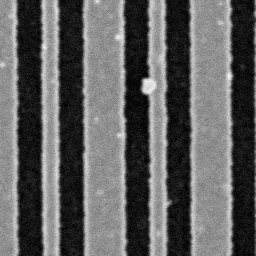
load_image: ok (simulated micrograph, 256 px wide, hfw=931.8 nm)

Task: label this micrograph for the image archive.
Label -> lines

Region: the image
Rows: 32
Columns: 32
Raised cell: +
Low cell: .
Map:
++...++....++++....++...+++++...
++...++...+++++....++...+++++...
++...++...+++++....++...+++++...
++...++...+++++....++...+++++...
++...++...+++++....++...+++++...
++...++....++++....++...+++++...
++...++....++++....++...+++++...
++...++...+++++....++...+++++...
++...++...+++++....++...+++++...
++...++....+++++...++...+++++...
++...++....++++...+++...+++++...
++...++...++++++..+++...+++++...
++...++....++++....++...+++++...
++...++....++++....++...+++++...
++...++....++++....++...+++++...
++...++....+++++...++...+++++...
++...++....+++++...++...+++++...
++...++....+++++...++...+++++...
++...++....+++++...++...+++++...
++...++...+++++....++...+++++...
++...++....+++++...++...+++++...
++...++....+++++...++...+++++...
++...++....+++++...++...+++++...
++...++....+++++...++...+++++...
++...++....+++++...++...+++++...
++...++....+++++...++...+++++...
++...++....+++++...++...+++++...
++...++....+++++...++...+++++...
++...++....+++++...++...+++++...
++...++....+++++...++...+++++...
++...++....+++++...++...+++++...
++...++....+++++...++...+++++...